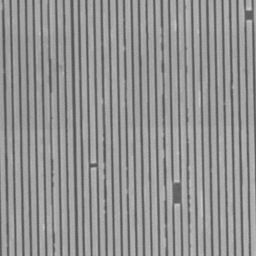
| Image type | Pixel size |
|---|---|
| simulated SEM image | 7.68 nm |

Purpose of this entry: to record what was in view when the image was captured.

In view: parallel lines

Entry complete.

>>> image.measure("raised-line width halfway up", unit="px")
5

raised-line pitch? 7.55 px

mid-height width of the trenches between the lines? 15.3 nm